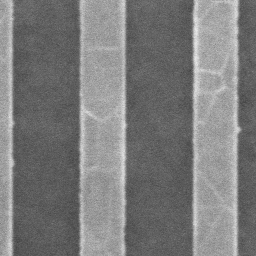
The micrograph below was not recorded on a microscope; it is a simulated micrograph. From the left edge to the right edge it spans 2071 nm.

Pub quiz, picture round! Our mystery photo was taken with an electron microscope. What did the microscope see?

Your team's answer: lines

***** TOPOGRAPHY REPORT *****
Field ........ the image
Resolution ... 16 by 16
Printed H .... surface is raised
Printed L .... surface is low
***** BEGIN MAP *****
HLLLLHHHLLLLHHHL
HLLLLHHHLLLLHHHL
HLLLLHHHLLLLHHHL
HLLLLHHHLLLLHHHL
HLLLLHHHLLLLHHHL
HLLLLHHHLLLLHHHL
HLLLLHHHLLLLHHHL
HLLLLHHHLLLLHHHL
HLLLLHHHLLLLHHHL
HLLLLHHHLLLLHHHL
HLLLLHHHLLLLHHHL
HLLLLHHHLLLLHHHL
HLLLLHHHLLLLHHHL
HLLLLHHHLLLLHHHL
HLLLLHHHLLLLHHHL
HLLLLHHHLLLLHHHL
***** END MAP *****